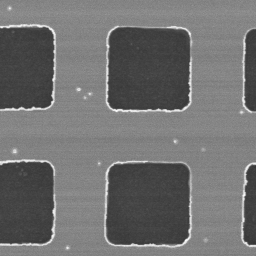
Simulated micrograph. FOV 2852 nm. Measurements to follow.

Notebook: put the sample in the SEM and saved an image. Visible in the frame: holes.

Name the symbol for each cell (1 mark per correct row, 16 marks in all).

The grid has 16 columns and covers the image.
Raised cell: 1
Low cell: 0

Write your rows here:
1111111111111111
1111111111111111
0001111000001110
0001111000001110
0001111000001110
0001111000001110
0001111000001110
1111111111111111
1111111111111111
1111111111111111
0001111000001111
0001111000001110
0001111000001110
0001111000001110
0001111000001110
1111111111111111